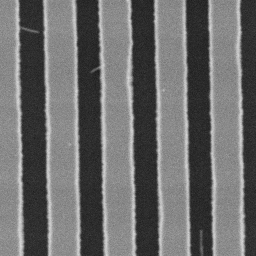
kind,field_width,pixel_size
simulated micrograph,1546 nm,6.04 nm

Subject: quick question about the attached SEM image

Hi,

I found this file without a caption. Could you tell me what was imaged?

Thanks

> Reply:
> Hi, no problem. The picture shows lines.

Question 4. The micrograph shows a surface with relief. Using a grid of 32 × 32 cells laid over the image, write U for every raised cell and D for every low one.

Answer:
UUDDDDUUUDDDUUUUDDDUUUUDDDUUUUDD
UUDDDDUUUDDDUUUUDDDUUUUDDDUUUUDD
UUDDDDUUUDDDUUUUDDDUUUUDDDUUUUDD
UUDDDDUUUUDDUUUUDDDUUUUDDDUUUUDD
UUDDDDUUUUDDUUUUDDDUUUUDDDUUUUDD
UUDDDDUUUUDDDUUUDDDUUUUDDDUUUUDD
UUDDDDUUUUDDDUUUDDDUUUUDDDUUUUDD
UUDDDDUUUUDDDUUUDDDUUUUDDDUUUUDD
UUDDDDUUUUDDDUUUDDDUUUUDDDUUUUDD
UUDDDDUUUUDDDUUUDDDDUUUDDDUUUUDD
UUDDDDUUUUDDDUUUDDDDUUUDDDUUUUDD
UUDDDDUUUUDDDUUUDDDDUUUDDDUUUUDD
UUDDDDUUUUDDDUUUDDDDUUUDDDUUUUDD
UUDDDDUUUUDDDUUUDDDDUUUDDDUUUUDD
UUUDDDUUUUDDDUUUUDDDUUUDDDUUUUDD
UUUDDDUUUUDDDUUUUDDDUUUDDDUUUUDD
UUUDDDUUUUDDDUUUUDDDUUUUDDUUUUDD
UUUDDDUUUUDDDUUUUDDDUUUUDDUUUUDD
UUUDDDUUUUDDDUUUUDDDUUUDDDUUUUDD
UUUDDDUUUUDDDUUUUDDDUUUUDDUUUUDD
UUUDDDUUUUDDDUUUUDDDUUUUDDUUUUDD
UUUDDDUUUUDDDUUUUDDDUUUUDDDUUUDD
UUUDDDUUUUDDDUUUUDDDUUUUDDDUUUDD
UUUDDDUUUUDDDUUUUDDDUUUUDDDUUUDD
UUUDDDUUUUDDDUUUUDDDUUUUDDDUUUDD
UUUDDDUUUUDDDUUUUDDDUUUUDDDUUUDD
UUUDDDUUUUDDDUUUUDDDUUUUDDDUUUDD
UUUDDDUUUUDDDUUUUDDDUUUUDDDUUUDD
UUUDDDUUUUDDDUUUUDDDUUUUDDDUUUDD
UUUDDDUUUUDDDUUUUDDDUUUUDDDUUUDD
UUUDDDUUUUDDDUUUUDDDUUUUDDDUUUDD
UUUDDDUUUUDDDUUUUDDDUUUUDDDUUUUD